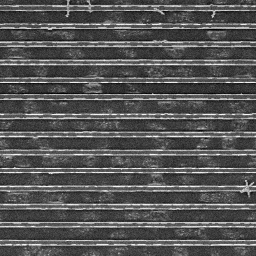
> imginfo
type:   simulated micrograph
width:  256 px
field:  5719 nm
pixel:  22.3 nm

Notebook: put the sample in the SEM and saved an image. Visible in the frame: parallel lines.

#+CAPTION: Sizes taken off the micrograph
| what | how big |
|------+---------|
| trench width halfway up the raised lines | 290 nanometres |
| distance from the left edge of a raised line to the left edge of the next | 402 nm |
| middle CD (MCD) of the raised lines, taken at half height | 117 nanometres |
